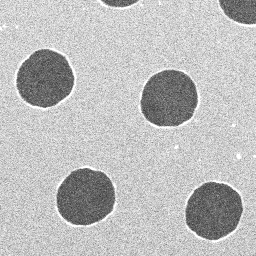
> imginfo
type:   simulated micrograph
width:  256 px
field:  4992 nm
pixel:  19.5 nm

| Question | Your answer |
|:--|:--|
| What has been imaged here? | holes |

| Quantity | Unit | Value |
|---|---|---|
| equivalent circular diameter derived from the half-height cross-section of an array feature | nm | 1140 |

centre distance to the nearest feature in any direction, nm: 2390